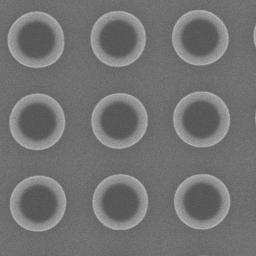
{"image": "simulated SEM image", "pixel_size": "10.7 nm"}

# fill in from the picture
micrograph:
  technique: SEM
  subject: an array of small figures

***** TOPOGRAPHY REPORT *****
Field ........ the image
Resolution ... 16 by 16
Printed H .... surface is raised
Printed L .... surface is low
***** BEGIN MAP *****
LLLLLLLLLLLLLLLL
LHHHLLHHHLLHHHLL
LHHHLLHHHLLHHHLL
LHHHLLHHHLLHHHLL
LLLLLLLLLLLLLLLL
LLLLLLLLLLLLLLLL
LHHHLLHHHLLHHHLL
LHHHLLHHHLLHHHLL
LHHHLLHHHLLHHHLL
LLLLLLLLLLLLLLLL
LLLLLLLLLLLLLLLL
LHHHLLHHHLLHHHLL
LHHHLLHHHLLHHHLL
LHHHLLHHHLLHHHLL
LLLLLLLLLLLLLLLL
LLLLLLLLLLLLLLLL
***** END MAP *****